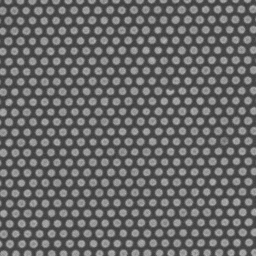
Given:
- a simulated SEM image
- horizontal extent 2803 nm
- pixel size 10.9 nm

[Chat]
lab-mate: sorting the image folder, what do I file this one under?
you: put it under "a regular array of raised bodies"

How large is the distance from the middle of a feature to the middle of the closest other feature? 125 nm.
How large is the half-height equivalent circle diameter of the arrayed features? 77.1 nm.